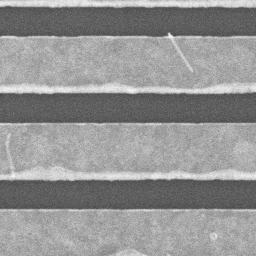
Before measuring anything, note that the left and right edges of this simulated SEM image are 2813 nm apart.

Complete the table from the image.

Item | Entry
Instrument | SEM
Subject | lines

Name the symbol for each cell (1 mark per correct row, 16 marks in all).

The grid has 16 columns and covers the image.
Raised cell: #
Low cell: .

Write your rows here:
................
................
################
################
################
################
................
................
################
################
################
................
................
################
################
################